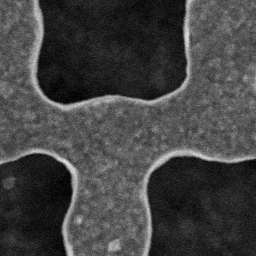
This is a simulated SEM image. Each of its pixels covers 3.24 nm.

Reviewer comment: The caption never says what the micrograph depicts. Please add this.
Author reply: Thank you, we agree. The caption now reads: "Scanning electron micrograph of holes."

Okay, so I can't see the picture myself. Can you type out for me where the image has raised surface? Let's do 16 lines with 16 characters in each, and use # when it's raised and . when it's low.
##..........####
###.........####
###.........####
##..........####
##..........####
##.........#####
####.###########
################
################
################
....######......
.....####.......
....#####.......
....#####.......
....#####.......
....#####.......